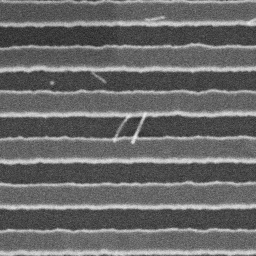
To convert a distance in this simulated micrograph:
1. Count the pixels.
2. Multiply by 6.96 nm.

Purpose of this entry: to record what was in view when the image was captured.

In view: lines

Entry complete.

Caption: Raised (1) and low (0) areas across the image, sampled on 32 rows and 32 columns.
11111111111111111111111111111111
11111111111111111111111111111111
11111111111111111111111111111111
00000000000000000000000000000000
00000000000000000000000000000000
00000000000000000000000010000000
11111111111111111111111111111111
11111111111111111111111111111111
11111111111111111111111111111111
00000000000000000000000000000000
00000000000000000000000000000000
11111111011111111111111111111111
11111111111111111111111111111111
11111111111111111111111111111111
00000100000000011100000000100000
00000000000000000000000000000000
00000000000000000000000000000000
11111111111111111111111111111111
11111111111111111111111111111111
11111111111111111111111111111111
00000000000000000000000000000000
00000000000000000000000000000000
00000000000000000000000000000000
11111111111111111111111111111111
11111111111111111111111111111111
11111111111111111111111111111111
00000000000000000000000000000000
00000000000000000000000000000000
00000000000000000000000000000000
11111111111111111111111111111111
11111111111111111111111111111111
11111111111111111111111111111111